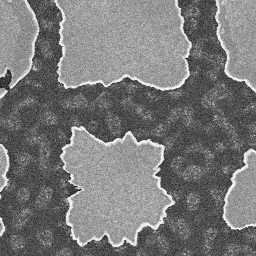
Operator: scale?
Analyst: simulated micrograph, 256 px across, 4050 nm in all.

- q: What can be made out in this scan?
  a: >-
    raised bodies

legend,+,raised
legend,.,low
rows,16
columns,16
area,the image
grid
++..+++++++...++
++..+++++++...++
++..++++++++..++
++..++++++++..++
++..++++++++..++
..........+.....
................
................
.....+..........
....++++++......
....++++++.....+
.....+++++....++
....+++++++...++
....++++++....++
.....++++.......
................